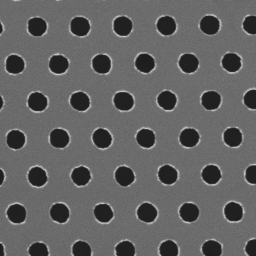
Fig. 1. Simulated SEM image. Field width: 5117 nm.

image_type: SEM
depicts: a regular array of holes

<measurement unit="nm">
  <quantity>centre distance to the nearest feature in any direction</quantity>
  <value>854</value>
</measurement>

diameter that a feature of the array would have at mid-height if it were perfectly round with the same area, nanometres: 395